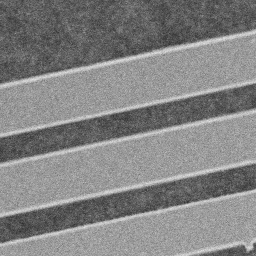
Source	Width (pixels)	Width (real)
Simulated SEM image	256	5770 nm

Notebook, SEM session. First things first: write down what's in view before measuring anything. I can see one or a few lines or trenches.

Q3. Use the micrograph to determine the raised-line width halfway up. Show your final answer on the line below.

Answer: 1080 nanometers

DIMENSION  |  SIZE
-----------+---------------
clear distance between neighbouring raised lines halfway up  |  661 nm